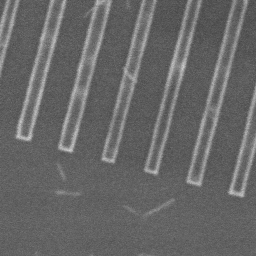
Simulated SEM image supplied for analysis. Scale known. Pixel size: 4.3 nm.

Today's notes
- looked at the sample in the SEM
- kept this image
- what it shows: parallel lines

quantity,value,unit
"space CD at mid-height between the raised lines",138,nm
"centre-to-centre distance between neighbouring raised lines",190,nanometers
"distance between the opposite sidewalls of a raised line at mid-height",53.6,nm